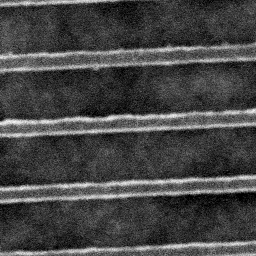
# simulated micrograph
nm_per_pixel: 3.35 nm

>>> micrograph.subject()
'one or a few lines or trenches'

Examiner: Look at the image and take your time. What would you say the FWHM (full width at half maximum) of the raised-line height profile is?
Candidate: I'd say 44.3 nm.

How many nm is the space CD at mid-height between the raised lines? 176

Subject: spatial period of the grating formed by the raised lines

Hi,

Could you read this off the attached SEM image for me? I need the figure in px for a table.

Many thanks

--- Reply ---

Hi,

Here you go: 65.6